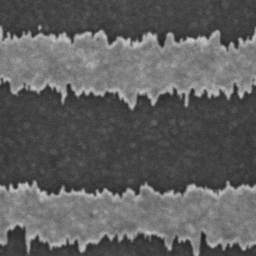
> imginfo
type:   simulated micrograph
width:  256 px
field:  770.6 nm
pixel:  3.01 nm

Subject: one or a few lines or trenches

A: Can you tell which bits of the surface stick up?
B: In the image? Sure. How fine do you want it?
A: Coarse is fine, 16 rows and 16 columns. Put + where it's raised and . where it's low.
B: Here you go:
................
................
+++++++..++..+..
++++++++++++++++
++++++++++++++++
..++++++++++++++
................
................
................
................
................
................
++++++++++++++++
++++++++++++++++
+.++++++++++++++
................